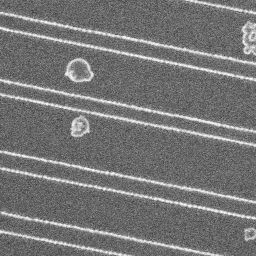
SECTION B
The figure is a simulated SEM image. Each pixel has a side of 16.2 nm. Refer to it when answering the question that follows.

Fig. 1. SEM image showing lines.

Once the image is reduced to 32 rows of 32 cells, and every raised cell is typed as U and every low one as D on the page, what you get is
DDDDDDDDDDDDDDDDDDDDDDDDDDUUUUUU
DDDDDDDDDDDDDDDDDDDDDDDDDDDDDDDU
UUUUUDDDDDDDDDDDDDDDDDDDDDDDDDDD
UUUUUUUUUUDDDDDDDDDDDDDDDDDDDDDU
DDDDDUUUUUUUUUUDDDDDDDDDDDDDDDDU
DDDDDDDDDDUUUUUUUUUUDDDDDDDDDDDU
DDDDDDDDDDDDDDUUUUUUUUUUDDDDDDDD
DDDDDDDDDDDDDDDDDDDUUUUUUUUUUUDD
DDDDDDDDDUUDDDDDDDDDDDDDUUUUUUUU
DDDDDDDDDUUDDDDDDDDDDDDDDDDDDUUU
UUDDDDDDDDDDDDDDDDDDDDDDDDDDDDDD
UUUUUUUDDDDDDDDDDDDDDDDDDDDDDDDD
DDDUUUUUUUUUDDDDDDDDDDDDDDDDDDDD
DDDDDDDDUUUUUUUUUDDDDDDDDDDDDDDD
DDDDDDDDDDDDDUUUUUUUUUDDDDDDDDDD
DDDDDDDDDUUDDDDDDDUUUUUUUUUDDDDD
DDDDDDDDDUDDDDDDDDDDDDDUUUUUUUUU
DDDDDDDDDDDDDDDDDDDDDDDDDDDDUUUU
DDDDDDDDDDDDDDDDDDDDDDDDDDDDDDDD
UUUDDDDDDDDDDDDDDDDDDDDDDDDDDDDD
UUUUUUUUDDDDDDDDDDDDDDDDDDDDDDDD
DDUUUUUUUUUUUDDDDDDDDDDDDDDDDDDD
DDDDDDDUUUUUUUUUUUDDDDDDDDDDDDDD
DDDDDDDDDDDDUUUUUUUUUUUDDDDDDDDD
DDDDDDDDDDDDDDDDDUUUUUUUUUUUDDDD
DDDDDDDDDDDDDDDDDDDDDDUUUUUUUUUU
DDDDDDDDDDDDDDDDDDDDDDDDDDDUUUUU
UUUUUDDDDDDDDDDDDDDDDDDDDDDDDDDD
UUUUUUUUUUDDDDDDDDDDDDDDDDDDDDDD
DDDUUUUUUUUUUUUDDDDDDDDDDDDDDDDD
DDDDDDDDUUUUUUUUUUUUDDDDDDDDDDDD
DDDDDDDDDDDDDUUUUUUUUUUUUDDDDDDD